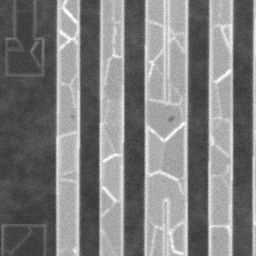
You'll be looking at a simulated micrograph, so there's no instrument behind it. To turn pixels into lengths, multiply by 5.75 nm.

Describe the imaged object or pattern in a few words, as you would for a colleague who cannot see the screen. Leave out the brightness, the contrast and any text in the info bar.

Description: wiring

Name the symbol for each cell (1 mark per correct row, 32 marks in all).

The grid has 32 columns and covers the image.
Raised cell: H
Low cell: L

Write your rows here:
LLHHLLLHHHLLLHHLLLHHHHHLLLHHHLLL
LLHHLLLLHHLLLHHLLLHHHHHLLLHHHLLL
LLHHLLLLLHLLLHHLLLHHHHHLLLHHHLLL
LLHHLLLLLLLLLHHLLLHHHHHLLLHHHLLL
LLHHLLLHLHLLLHHLLLHHHHHLLLHHHLLL
LHHHHLLHHHLLLHHLLLHHHHHLLLHHHLLL
LHHHHLLHHHLLLHHLLLHHHHHLLLHHHLLL
LHHHHLLHHHLLLHHLLLHHHHHLLLHHHLLL
LHHHHLLHHHLLLHHLLLHHHHHLLLHHHLLL
LLLLLLLHHHLLLHHLLLHHHHHLLLHHHLLL
LLLLLLLHHHLLLHHLLLHHHHHLLLHHHLLL
LLLLLLLHHHLLLHHLLLHHHHHLLLHHHLLL
LLLLLLLHHHLLLHHLLLHHHHHLLLHHHLLL
LLLLLLLHHHLLLHHLLLHHHHHLLLHHHLLL
LLLLLLLHHHLLLHHLLLHHHHHLLLHHHLLL
LLLLLLLHHHLLLHHLLLHHHHHLLLHHHLLL
LLLLLLLHHHLLLHHLLLHHHHHLLLHHHLLL
LLLLLLLHHHLLLHHLLLHHHHHLLLHHHLLL
LLLLLLLHHHLLLHHLLLHHHHHLLLHHHLLL
LLLLLLLHHHLLLHHLLLHHHHHLLLHHHLLL
LLLLLLLHHHLLLHHLLLHHHHHLLLHHHLLL
LLLLLLLHHHLLLHHLLLHHHHHLLLHHHLLL
LLLLLLLHHHLLLHHLLLHHHHHLLLHHHLLL
LLLLLLLHHHLLLHHLLLHHHHHLLLHHHLLL
LLLLLLLHHHLLLHHLLLHHHHHLLLHHHLLL
LLLLLLLHHHLLLHHLLLHHHHHLLLHHHLLL
LLLLLLLHHHLLLHHLLLHHHHHLLLHHHLLL
LLLLLLLHHHLLLHHLLLHHHHHLLLHHHLLL
HHHHHHLHHHLLLHHLLLHHHHHLLLLLHLLL
HHHHHHLHHHLLLHHLLLHHHHHLLLLLLLLL
HHHHHHLHHHLLLHHLLLHHHHHLLLLLLLLL
HHHHHHLHHHLLLHHLLLHHHHHLLLLLLLLL